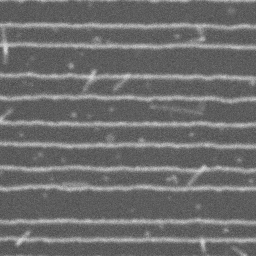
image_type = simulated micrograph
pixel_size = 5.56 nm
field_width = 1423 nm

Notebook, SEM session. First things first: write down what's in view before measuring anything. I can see lines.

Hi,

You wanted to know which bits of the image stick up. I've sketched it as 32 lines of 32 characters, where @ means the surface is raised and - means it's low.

--------------------------------
--------------------------------
--------------------------------
@@@@@@@@@@@@@@@@@@@@@@@@@@@@@@@@
@@@@@@@@@@@@@@@@@@@@@@@@@@@@@@@@
@@@@@@@@@@@@@@@@@@@@@@@@@@@@@@@@
--------------------------------
--------------------------------
--------------------------------
@@@@@@@@@@-@-@-@@@-@------------
@@@@@@@@@@@@@@@@@@@@@@@@@@@@@@@@
@@@@@@@@@@@@@@@@@@@@@@@@@@@@@@@@
------------------@--------@@@@@
--------------------------------
--------------------------------
@@@@@@@@@@-@@-@@--@@-@--@@------
@@@@@@@@@@@@@@@@@@@@@@@@@@@@@@@@
@@@@@@@@@@@@@@@@@@@@@@@@@@@@@@@@
--------------------------------
--------------------------------
--------------------------------
@@@@@@@@@@@@@@@@@@@@@@@@@@@@@@@@
@@@@@@@@@@@@@@@@@@@@@@@@@@@@@@@@
@@@@@--@@@@@@@@@@@@@@@@@@@@@@@@@
--------------------------------
--------------------------------
--------------------------------
------------------------@-------
@@@@@@@@@@@@@@@@@@@@@@@@@@@@@@@@
@@@@@@@@@@@@@@@@@@@@@@@@@@@@@@@@
--------------------------------
--------------------------------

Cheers